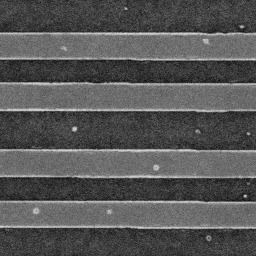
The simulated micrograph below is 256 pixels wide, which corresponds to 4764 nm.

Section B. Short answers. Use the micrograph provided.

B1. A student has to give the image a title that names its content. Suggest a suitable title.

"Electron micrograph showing lines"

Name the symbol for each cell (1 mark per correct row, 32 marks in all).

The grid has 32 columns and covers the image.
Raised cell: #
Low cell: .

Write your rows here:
................................
................................
................................
................................
################################
################################
################################
................................
................................
................................
####............................
################################
################################
################################
................................
................................
................................
................................
................................
################################
################################
################################
................................
................................
................................
################################
################################
################################
................................
................................
................................
................................